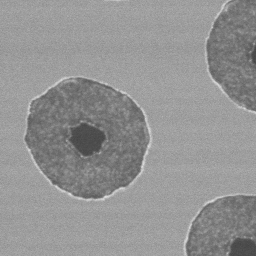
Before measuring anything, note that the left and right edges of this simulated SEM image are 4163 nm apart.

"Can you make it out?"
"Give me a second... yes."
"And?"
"ring-shaped grooves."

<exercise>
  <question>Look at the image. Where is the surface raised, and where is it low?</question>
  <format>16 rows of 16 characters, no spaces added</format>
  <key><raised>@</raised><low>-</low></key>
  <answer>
@@@@@@@@@@@@@@--
@@@@@@@@@@@@@---
@@@@@@@@@@@@@---
@@@@@@@@@@@@@---
@@@@@@@@@@@@@---
@@@----@@@@@@@--
@@-------@@@@@@-
@@-------@@@@@@@
@@--@@@--@@@@@@@
@@---@---@@@@@@@
@@-------@@@@@@@
@@@-----@@@@@@@@
@@@@@@@@@@@@@---
@@@@@@@@@@@@----
@@@@@@@@@@@@----
@@@@@@@@@@@@--@@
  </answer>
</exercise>